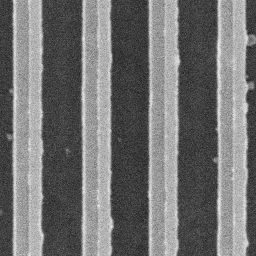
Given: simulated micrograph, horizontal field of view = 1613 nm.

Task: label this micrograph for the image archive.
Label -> lines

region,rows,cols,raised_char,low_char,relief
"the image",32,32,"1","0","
00111000001111000001110000011110
00111000001111000001110000011110
00111000001111000001110000011110
00111000001111000001110000011110
00111000001111000001110000011110
00111000001111000001110000011110
00111000001111000001110000011110
00111000001111000001110000011110
00111000001111000001110000011110
00111000001111000001110000011110
00111000001111000001110000011110
00111000001111000001110000011110
00111000001111000001110000011110
00111000001111000001110000011110
00111000001111000001110000011110
00111000001111000001110000011110
00111000001111000001110000011110
00111000001111000001110000011110
00111000001111000001110000011110
00111000001111000001110000011110
00111000001111000001110000011110
00111000001111000001110000011110
00111000001111000001110000011110
00111000001111000001110000011110
00111000001111000001110000011110
00111000001111000001110000011110
00111000001111000001110000011110
00111000001111000001110000011110
00111000001111000001110000011110
00111000001111000001110000011110
00111000001111000001110000011110
00111000001111000001110000011110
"